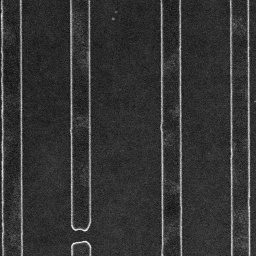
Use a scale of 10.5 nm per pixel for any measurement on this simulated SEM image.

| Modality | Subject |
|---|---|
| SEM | one or a few lines or trenches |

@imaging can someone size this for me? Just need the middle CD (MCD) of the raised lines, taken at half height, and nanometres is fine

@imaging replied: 198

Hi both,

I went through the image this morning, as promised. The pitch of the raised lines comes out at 796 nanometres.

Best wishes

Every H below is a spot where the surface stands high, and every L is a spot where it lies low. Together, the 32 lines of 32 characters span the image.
HHHLLLLLLHHLLLLLLLLLHHLLLLLLLHHL
HHHLLLLLLHHLLLLLLLLLHHLLLLLLLHHL
HHHLLLLLLHHLLLLLLLLLHHLLLLLLLHHL
HHHLLLLLLHHLLLLLLLLLHHLLLLLLLHHL
HHHLLLLLLHHLLLLLLLLLHHLLLLLLLHHL
HHHLLLLLLHHLLLLLLLLLHHLLLLLLLHHL
HHHLLLLLLHHLLLLLLLLLHHLLLLLLLHHL
HHHLLLLLLHHLLLLLLLLLHHHLLLLLLHHL
HHHLLLLLLHHLLLLLLLLLHHHLLLLLLHHL
HHHLLLLLLHHLLLLLLLLLHHHLLLLLLHHL
HHHLLLLLLHHLLLLLLLLLHHHLLLLLLHHL
HHHLLLLLLHHLLLLLLLLLHHHLLLLLLHHL
HHHLLLLLLHHLLLLLLLLLHHHLLLLLLHHL
HHHLLLLLLHHLLLLLLLLLHHHLLLLLLHHL
HHHLLLLLLHHLLLLLLLLLHHHLLLLLLHHL
HHHLLLLLLHHLLLLLLLLLHHHLLLLLLHHL
HHHLLLLLLHHLLLLLLLLLHHHLLLLLLHHL
HHHLLLLLLHHLLLLLLLLLHHHLLLLLLHHL
HHHLLLLLLHHLLLLLLLLLHHHLLLLLLHHL
HHHLLLLLLHHLLLLLLLLLHHHLLLLLLHHL
HHHLLLLLLHHLLLLLLLLLHHHLLLLLLHHL
HHHLLLLLLHHLLLLLLLLLHHHLLLLLLHHL
HHHLLLLLLHHLLLLLLLLLHHHLLLLLLHHL
HHHLLLLLLHHLLLLLLLLLHHHLLLLLLHHL
HHHLLLLLLHHLLLLLLLLLHHHLLLLLLHHL
HHHLLLLLLHHLLLLLLLLLHHHLLLLLLHHL
HHHLLLLLLHHLLLLLLLLLHHHLLLLLLHHL
HHHLLLLLLHHLLLLLLLLLHHHLLLLLLHHL
HHHLLLLLLHHLLLLLLLLLHHHLLLLLLHHL
HHHLLLLLLLLLLLLLLLLLHHHLLLLLLHHL
HHHLLLLLLHHLLLLLLLLLHHHLLLLLLHHL
HHHLLLLLLHHLLLLLLLLLHHHLLLLLLHHL